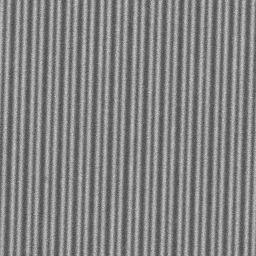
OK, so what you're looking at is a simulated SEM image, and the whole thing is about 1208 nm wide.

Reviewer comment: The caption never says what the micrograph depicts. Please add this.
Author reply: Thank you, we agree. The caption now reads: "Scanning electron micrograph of parallel lines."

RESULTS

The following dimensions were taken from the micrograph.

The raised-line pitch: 0.0397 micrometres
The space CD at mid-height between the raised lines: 22.4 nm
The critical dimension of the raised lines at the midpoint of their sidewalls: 0.0177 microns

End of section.